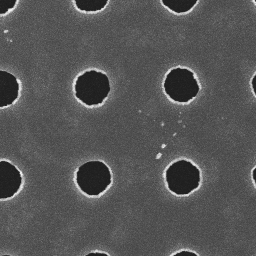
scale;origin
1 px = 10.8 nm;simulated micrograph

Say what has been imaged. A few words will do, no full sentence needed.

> holes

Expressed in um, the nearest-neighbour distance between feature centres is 0.961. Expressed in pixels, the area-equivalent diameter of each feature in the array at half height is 34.